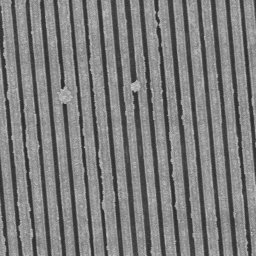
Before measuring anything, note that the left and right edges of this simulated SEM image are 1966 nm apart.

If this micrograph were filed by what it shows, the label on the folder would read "parallel lines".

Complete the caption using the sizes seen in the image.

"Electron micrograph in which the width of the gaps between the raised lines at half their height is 0.0335 µm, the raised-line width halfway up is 72.6 nm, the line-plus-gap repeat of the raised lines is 14.3 pixels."